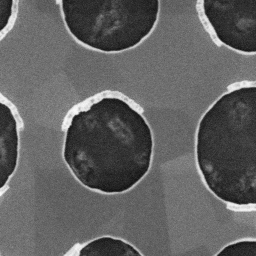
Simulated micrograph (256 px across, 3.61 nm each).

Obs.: holes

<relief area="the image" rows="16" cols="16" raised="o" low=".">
.ooo......ooo...
oooo......ooo...
ooooo....ooooo..
oooooooooooooooo
oooooooooooooooo
ooooooooooooooo.
oooooo..ooooo...
.oooo....oooo...
.ooo.....ooo....
.ooo.....ooo....
.ooo.....ooo....
ooooo...ooooo...
oooooooooooooo..
oooooooooooooooo
oooooooooooooooo
ooooo...oooooo..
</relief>